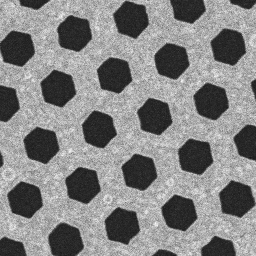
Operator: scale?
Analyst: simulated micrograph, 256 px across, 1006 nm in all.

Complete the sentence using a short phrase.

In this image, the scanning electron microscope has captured a regular array of holes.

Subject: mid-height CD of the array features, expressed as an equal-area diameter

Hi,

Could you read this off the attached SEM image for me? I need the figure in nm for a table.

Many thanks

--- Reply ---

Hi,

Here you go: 137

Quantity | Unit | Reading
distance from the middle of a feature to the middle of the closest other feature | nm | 224